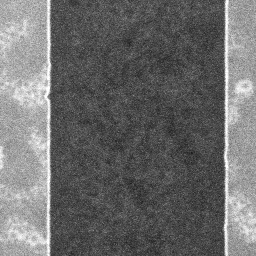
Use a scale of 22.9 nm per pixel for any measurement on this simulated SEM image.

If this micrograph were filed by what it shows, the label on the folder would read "one or a few lines or trenches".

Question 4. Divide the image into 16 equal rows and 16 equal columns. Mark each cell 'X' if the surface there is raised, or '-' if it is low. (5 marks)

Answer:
---XXXXXXXXXXX--
---XXXXXXXXXXX--
---XXXXXXXXXXX--
---XXXXXXXXXXX--
---XXXXXXXXXXX--
---XXXXXXXXXXX--
---XXXXXXXXXXX--
---XXXXXXXXXXX--
---XXXXXXXXXXX--
---XXXXXXXXXXX--
---XXXXXXXXXXX--
---XXXXXXXXXXX--
---XXXXXXXXXXX--
---XXXXXXXXXXX--
---XXXXXXXXXXX--
---XXXXXXXXXXX--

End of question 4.